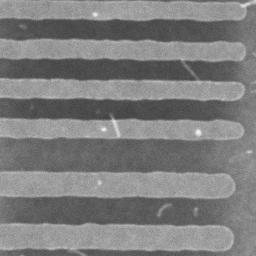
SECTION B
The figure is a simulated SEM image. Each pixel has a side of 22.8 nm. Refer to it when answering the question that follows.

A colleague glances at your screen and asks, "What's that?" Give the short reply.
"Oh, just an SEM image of groups of lines, slits or small figures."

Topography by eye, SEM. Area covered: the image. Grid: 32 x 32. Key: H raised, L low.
HHHHHHHHHHHHHHHHHHHHHHHHHHHHHHLL
HHHHHHHHHHHHHHHHHHHHHHHHHHHHHHHL
LLLLLLLLLLLLLLLLHHHLLLLLHHHHLLLL
LLLLLLLLLLLLLLLLLLLLLLLLLLLLLLLL
LLLLLLLLLLLLLLLLLLLLLLLLLLLLLLLL
HHHHHHHHHHHHHHHHHHHHHHHHHHHHHHLL
HHHHHHHHHHHHHHHHHHHHHHHHHHHHHHHL
LLLLLLLLLLLLLLLLLLLLLLLLHHHHLHLL
LLLLLLLLLLLLLLLLLLLLLLLLLLLLLLLL
LLLLLLLLLLLLLLLLLLLLLLLLLLLLLLLL
HHHHHHHHHHHHHHHHHHHHHHHHHHHHHHLL
HHHHHHHHHHHHHHHHHHHHHHHHHHHHHHHL
LLLLLLLLLLLLLLLLLLLLLLLLLLLLLLLL
LLLLLLLLLLLLLLLLLLLLLLLLLLLLLLLL
LLLLLLLLLLLLLLLLLLLLLLLLLLLLLLLL
HHHHHHHHHHHHHHHHHHHHHHHHHHHHHHLL
HHHHHHHHHHHHHHHHHHHHHHHHHHHHHHLL
LLLLLLLLLLLLLLLLLLLLLLLLLLLLLLLL
LLLLLLLLLLLLLLLLLLLLLLLLLLLLLLLL
LLLLLLLLLLLLLLLLLLLLLLLLLLLLLLLL
LLLLLLLLLLLLLLLLLLLLLLLLLLLLLLLL
LLLLLLLLLLLLLLLLLLLLLLLLLLLLLLLL
HHHHHHHHHHHHHHHHHHHHHHHHHHHHHLLL
HHHHHHHHHHHHHHHHHHHHHHHHHHHHHLLL
LHHHHHHHLHHHHHHHHHHHHHHHHHHHHLLL
LLLLLLLLLLLLLLLLLLLLLLLLLLLLLLLL
LLLLLLLLLLLLLLLLLLLLLLLLLLLLLLLL
LLLLLLLLLLLLLLLLLLLLLLLLLLLLLLLL
HHHHHHHHHHHHHHHHHHHHHHHHHHHHLLLL
HHHHHHHHHHHHHHHHHHHHHHHHHHHHHLLL
HHHHHHHHHHHHHHHHHHHHHHHHHHHHHLLL
LLLLLLLLLLLLLLLLLLLLLLLLLLLLLLLL